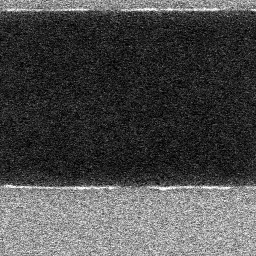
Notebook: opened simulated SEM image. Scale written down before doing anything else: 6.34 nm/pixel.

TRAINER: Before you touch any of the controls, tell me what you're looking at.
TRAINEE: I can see one or a few lines or trenches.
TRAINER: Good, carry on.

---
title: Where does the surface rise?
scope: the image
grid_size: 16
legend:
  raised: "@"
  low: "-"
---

----------------
@@@@@@@@@@@@@@@@
@@@@@@@@@@@@@@@@
@@@@@@@@@@@@@@@@
@@@@@@@@@@@@@@@@
@@@@@@@@@@@@@@@@
@@@@@@@@@@@@@@@@
@@@@@@@@@@@@@@@@
@@@@@@@@@@@@@@@@
@@@@@@@@@@@@@@@@
@@@@@@@@@@@@@@@@
@@@@@@@@@@@@@@@@
----------------
----------------
----------------
----------------